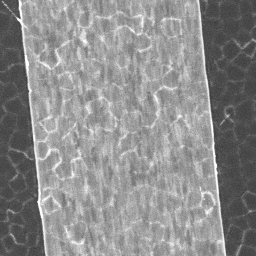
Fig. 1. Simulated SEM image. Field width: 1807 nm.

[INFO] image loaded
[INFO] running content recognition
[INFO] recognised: one or a few lines or trenches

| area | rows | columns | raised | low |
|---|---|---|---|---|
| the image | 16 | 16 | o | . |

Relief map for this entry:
.ooooooooooo....
.oooooooooooo...
.oooooooooooo...
..ooooooooooo...
..ooooooooooo...
..ooooooooooo...
..ooooooooooo...
..ooooooooooo...
..ooooooooooo...
..ooooooooooo...
..oooooooooooo..
..oooooooooooo..
..oooooooooooo..
...ooooooooooo..
...ooooooooooo..
...ooooooooooo..